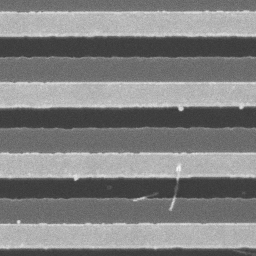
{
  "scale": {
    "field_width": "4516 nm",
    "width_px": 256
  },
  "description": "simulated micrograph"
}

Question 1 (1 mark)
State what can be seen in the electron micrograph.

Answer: lines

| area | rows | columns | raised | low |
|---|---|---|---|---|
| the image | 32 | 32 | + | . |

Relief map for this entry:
++++++++++++++++++++++++++++++++
++++++++++++++++++++++++++++++++
++++++++++++++++++++++++++++++++
++++++++++++++++++++++++++++++++
++++++++++++++++++++++++++++++++
................................
................................
++++++++++++++++++++++++++++++++
++++++++++++++++++++++++++++++++
++++++++++++++++++++++++++++++++
++++++++++++++++++++++++++++++++
++++++++++++++++++++++++++++++++
++++++++++++++++++++++++++++++++
......................+.........
................................
................................
++++++++++++++++++++++++++++++++
++++++++++++++++++++++++++++++++
++++++++++++++++++++++++++++++++
++++++++++++++++++++++++++++++++
++++++++++++++++++++++++++++++++
++++++++++++++++++++++++++++++++
................................
................................
................................
++++++++++++++++++++++++++++++++
++++++++++++++++++++++++++++++++
++++++++++++++++++++++++++++++++
++++++++++++++++++++++++++++++++
++++++++++++++++++++++++++++++++
++++++++++++++++++++++++++++++++
................................